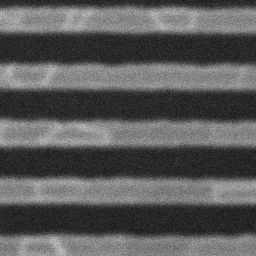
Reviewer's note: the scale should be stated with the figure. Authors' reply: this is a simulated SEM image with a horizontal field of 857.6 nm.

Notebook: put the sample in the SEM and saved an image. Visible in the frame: lines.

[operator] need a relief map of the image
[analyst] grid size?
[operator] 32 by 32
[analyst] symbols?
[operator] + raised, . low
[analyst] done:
................................
++++++++++++++++++++++++++++++++
++++++++++++++++++++++++++++++++
++++++++++++++++++++++++++++++++
................................
................................
................................
................................
++++++++++++++++++++++++++++++++
++++++++++++++++++++++++++++++++
++++++++++++++++++++++++++++++++
................................
................................
................................
................................
++++++++++++++++.++++++++++...++
++++++++++++++++++++++++++++++++
++++++++++++++++++++++++++++++++
................................
................................
................................
................................
++.+.+++++..+.+++++.......+.....
++++++++++++++++++++++++++++++++
++++++++++++++++++++++++++++++++
................................
................................
................................
................................
................................
++++++++++++++++++++++++++++++++
++++++++++++++++++++++++++++++++